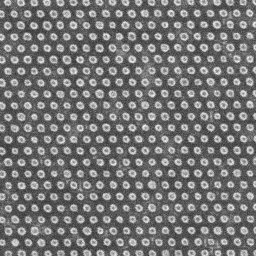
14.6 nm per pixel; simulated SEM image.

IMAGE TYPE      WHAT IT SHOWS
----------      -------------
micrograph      a regular array of raised bodies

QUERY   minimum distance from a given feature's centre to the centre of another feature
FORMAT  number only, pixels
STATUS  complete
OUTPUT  12.9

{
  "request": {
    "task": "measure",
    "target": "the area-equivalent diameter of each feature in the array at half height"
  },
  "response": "96 nm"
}